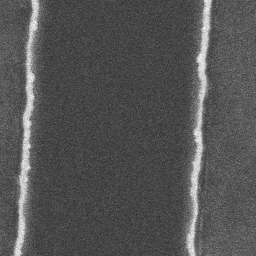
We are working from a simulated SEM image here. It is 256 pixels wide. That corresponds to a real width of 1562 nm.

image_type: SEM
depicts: one or a few lines or trenches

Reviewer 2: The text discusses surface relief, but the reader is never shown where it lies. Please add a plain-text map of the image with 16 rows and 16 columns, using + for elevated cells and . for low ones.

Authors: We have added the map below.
..+++++++++++...
..+++++++++++...
..+++++++++++...
..+++++++++++...
..+++++++++++...
..+++++++++++...
..+++++++++++...
..++++++++++....
..+++++++++++...
.++++++++++++...
.+++++++++++....
.+++++++++++....
.+++++++++++....
.+++++++++++....
.+++++++++++....
.+++++++++++....